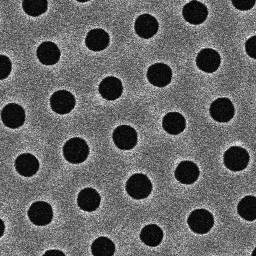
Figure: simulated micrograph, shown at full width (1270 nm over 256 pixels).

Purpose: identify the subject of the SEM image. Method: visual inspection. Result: a regular array of holes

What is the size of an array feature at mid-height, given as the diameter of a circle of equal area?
124 nm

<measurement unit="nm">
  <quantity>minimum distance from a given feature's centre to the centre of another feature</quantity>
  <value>250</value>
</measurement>